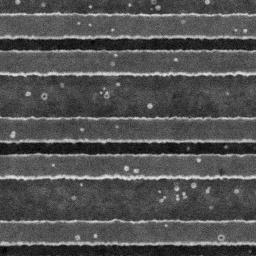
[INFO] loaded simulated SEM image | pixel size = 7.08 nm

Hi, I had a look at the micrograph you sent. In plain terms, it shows lines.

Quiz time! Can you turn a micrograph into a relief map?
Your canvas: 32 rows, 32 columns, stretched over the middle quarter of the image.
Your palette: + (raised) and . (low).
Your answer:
++++++++++++++++++++++++++++++++
++++++++++++++++++++++++++++++++
++++++++++++++++++++++++++++++++
................................
................................
................................
................................
................................
................................
................................
................................
................................
................................
.......................+.+.++...
++++++++++++++++++++++++++++++++
++++++++++++++++++++++++++++++++
++++++++++++++++++++++++++++++++
++++++++++++++++++++++++++++++++
++++++++++++++++++++++++++++++++
..+......++..........+.+....+...
................................
................................
........................+.......
++++++++++++++++++++++++++++++++
++++++++++++++++++++++++++++++++
++++++++++++++++++++++++++++++++
++++++++++++++++++++++++++++++++
++++++++++++++++++++++++++++++++
.++++.++++..+.++++++++++..++.+++
................................
................................
................................